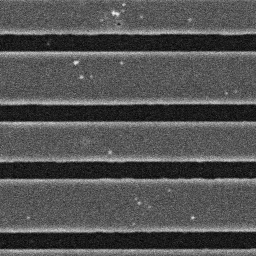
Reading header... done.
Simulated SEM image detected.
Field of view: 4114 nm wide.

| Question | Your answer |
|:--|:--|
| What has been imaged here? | lines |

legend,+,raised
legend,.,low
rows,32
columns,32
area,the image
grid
++++++++++++++++++++++++++++++++
++++++++++++++++++++++++++++++++
++++++++++++++++++++++++++++++++
++++++++++++++++++++++++++++++++
................................
................................
................................
++++++++++++++++++++++++++++++++
++++++++++++++++++++++++++++++++
++++++++++++++++++++++++++++++++
++++++++++++++++++++++++++++++++
++++++++++++++++++++++++++++++++
++++++++++++++++++++++++++++++++
................................
................................
++++++++++++++++++++++++++++++++
++++++++++++++++++++++++++++++++
++++++++++++++++++++++++++++++++
++++++++++++++++++++++++++++++++
++++++++++++++++++++++++++++++++
................................
................................
++++++++++++++++++++++++++++++++
++++++++++++++++++++++++++++++++
++++++++++++++++++++++++++++++++
++++++++++++++++++++++++++++++++
++++++++++++++++++++++++++++++++
++++++++++++++++++++++++++++++++
++++++++++++++++++++++++++++++++
................................
................................
++++++++++++++++++++++++++++++++